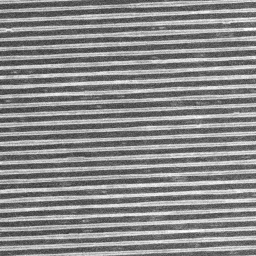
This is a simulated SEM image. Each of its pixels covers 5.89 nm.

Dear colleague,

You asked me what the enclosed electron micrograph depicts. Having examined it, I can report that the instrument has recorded parallel lines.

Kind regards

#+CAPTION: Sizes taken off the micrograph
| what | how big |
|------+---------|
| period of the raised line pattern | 55.9 nanometers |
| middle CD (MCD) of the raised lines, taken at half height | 16.9 nm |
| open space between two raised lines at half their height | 0.039 um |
